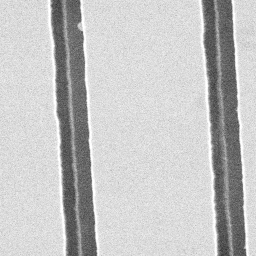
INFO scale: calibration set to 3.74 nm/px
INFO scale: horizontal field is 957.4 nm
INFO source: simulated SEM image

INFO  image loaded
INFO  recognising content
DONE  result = lines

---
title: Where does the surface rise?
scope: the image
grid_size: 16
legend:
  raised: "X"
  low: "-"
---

XXX--XXXXXXXX--X
XXX--XXXXXXXX--X
XXX--XXXXXXXX--X
XXX--XXXXXXXX--X
XXX--XXXXXXXX--X
XXX--XXXXXXXX--X
XXX--XXXXXXXX--X
XXXX--XXXXXXX--X
XXXX--XXXXXXX--X
XXXX--XXXXXXX--X
XXXX--XXXXXXX--X
XXXX--XXXXXXX--X
XXXX--XXXXXXX--X
XXXX--XXXXXXX--X
XXXX--XXXXXXX--X
XXXX--XXXXXXXX-X